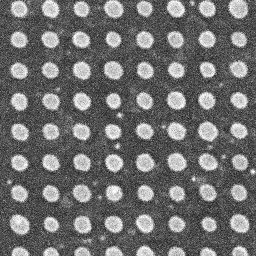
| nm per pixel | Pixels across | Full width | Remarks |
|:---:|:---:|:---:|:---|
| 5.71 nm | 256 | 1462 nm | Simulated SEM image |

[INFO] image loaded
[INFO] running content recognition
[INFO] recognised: a regular array of raised bodies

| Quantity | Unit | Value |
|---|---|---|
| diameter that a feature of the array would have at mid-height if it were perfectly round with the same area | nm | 87.1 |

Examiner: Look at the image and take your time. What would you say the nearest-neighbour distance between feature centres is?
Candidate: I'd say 174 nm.